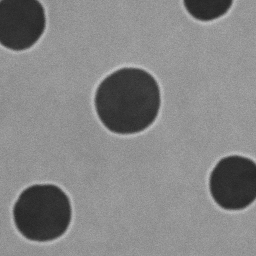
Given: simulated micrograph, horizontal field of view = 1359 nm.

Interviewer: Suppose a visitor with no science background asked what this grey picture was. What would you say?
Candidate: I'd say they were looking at holes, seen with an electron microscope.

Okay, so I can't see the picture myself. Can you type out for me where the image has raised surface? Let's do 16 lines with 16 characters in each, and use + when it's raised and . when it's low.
...+++++++++..++
...+++++++++++++
..++++++++++++++
++++++++++++++++
+++++++..+++++++
++++++....++++++
++++++....++++++
++++++....++++++
++++++++++++++++
++++++++++++++++
+++++++++++++...
+++++++++++++...
+...+++++++++...
+...++++++++++++
+...++++++++++++
++++++++++++++++